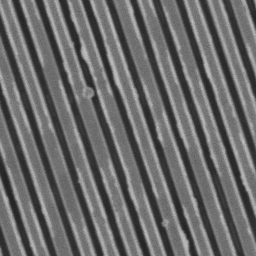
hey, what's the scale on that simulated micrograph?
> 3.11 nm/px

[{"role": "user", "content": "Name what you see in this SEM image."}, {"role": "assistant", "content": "parallel lines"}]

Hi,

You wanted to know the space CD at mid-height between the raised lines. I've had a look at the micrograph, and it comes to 24.7 nanometers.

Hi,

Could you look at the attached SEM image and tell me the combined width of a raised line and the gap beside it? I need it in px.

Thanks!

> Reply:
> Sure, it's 22.2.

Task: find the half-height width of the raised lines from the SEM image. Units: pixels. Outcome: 14.1